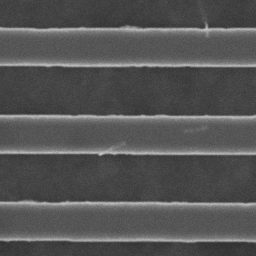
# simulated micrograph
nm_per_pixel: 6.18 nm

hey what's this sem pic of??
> lines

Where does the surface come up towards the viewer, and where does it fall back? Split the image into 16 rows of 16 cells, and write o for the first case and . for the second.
................
................
oooooooooooooooo
oooooooooooooooo
................
................
................
oooooooooooooooo
oooooooooooooooo
oooooooooooooooo
................
................
................
oooooooooooooooo
oooooooooooooooo
................